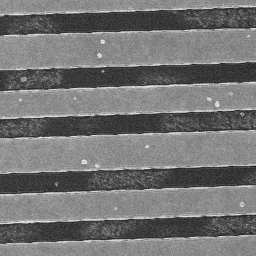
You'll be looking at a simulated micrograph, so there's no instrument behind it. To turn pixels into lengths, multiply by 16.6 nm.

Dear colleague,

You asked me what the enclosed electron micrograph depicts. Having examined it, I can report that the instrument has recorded lines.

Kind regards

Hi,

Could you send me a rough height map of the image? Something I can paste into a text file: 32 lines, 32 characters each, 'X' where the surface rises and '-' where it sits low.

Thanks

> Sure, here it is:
XXXXXXXXXXXXXXXXXXXXXXXXXXXXXXXX
XXXXXXXXXX----------------------
--------------------------------
--------------------------------
XXXXXXXXXXXXXXXXXXXXXXXXXXXXXXXX
XXXXXXXXXXXXXXXXXXXXXXXXXXXXXXXX
XXXXXXXXXXXXXXXXXXXXXXXXXXXXXXXX
XXXXXXXXXXXXXXXXXXXXXXXXXXXXXXXX
XXXXXXX-------------------------
--------------------------------
---------------------------XXXXX
-XXXXXXXXXXXXXXXXXXXXXXXXXXXXXXX
XXXXXXXXXXXXXXXXXXXXXXXXXXXXXXXX
XXXXXXXXXXXXXXXXXXXXXXXXXXXXXXXX
XXXXXXXX------------------------
--------------------------------
---------------------------XXXXX
XXXXXXXXXXXXXXXXXXXXXXXXXXXXXXXX
XXXXXXXXXXXXXXXXXXXXXXXXXXXXXXXX
XXXXXXXXXXXXXXXXXXXXXXXXXXXXXXXX
XXXXXXXXXXXXXXXXXXXXXXXXXXXXXXXX
XXXXX---------------------------
--------------------------------
------------------------XXXXXXXX
XXXXXXXXXXXXXXXXXXXXXXXXXXXXXXXX
XXXXXXXXXXXXXXXXXXXXXXXXXXXXXXXX
XXXXXXXXXXXXXXXXXXXXXXXXXXXXXXXX
XXXXXXXXXX----------------------
--------------------------------
-----------------------------XXX
XXXXXXXXXXXXXXXXXXXXXXXXXXXXXXXX
XXXXXXXXXXXXXXXXXXXXXXXXXXXXXXXX